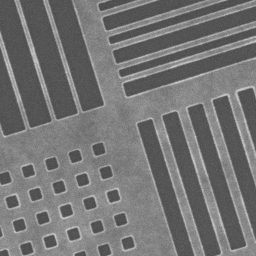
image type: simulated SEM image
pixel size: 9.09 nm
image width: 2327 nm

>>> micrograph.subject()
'groups of lines, slits or small figures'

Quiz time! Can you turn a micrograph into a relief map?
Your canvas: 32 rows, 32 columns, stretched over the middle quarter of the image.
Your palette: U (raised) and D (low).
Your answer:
UDDDDDDUUUUUUUUUDDDDDDDDUUUUDDDD
UDDDDDDUUUUUUUDDDDDDDUUUUDDDDDDD
DDDDDDDDUUUUUUDDDDUUUUDDDDDDDDDD
DUDDDDDDUUUUUUUUUUDDDDDDDDDDDDDD
DUDDDDDDUUUUUUUUDDDDDDDDDDDDDUUU
DUDDDDDDDUUUUUUDDDDDDDDDDUUUUUUU
DDUDDDDDDUUUUUUDDDDDDDUUUUUUUUUU
DDUDDDDDDUUUUUUDDDDUUUUUUUUUUUUU
DDUUDDDDDDUUUUUUUUUUUUUUUUUUUUUU
DDDUDDDDDDUUUUUUUUUUUUUUUUUUUUUU
DDDUDDDDDDUUUUUUUUUUUUUUUUUUUUUU
DDDUDDUUUUUUUUUUUUUUUUUUUUUUUUUD
DDDUUUUUUUUUUUUUUUUUUUUUUDDDDUUD
UUUUUUUUUUUUUUUUUUUUUUUUDDDDDUUD
UUUUUUUUUUUUUUUUUUUDDDUUUDDDDUUU
UUUUUUUUUUUUUUUUUUDDDDDUUDDDDDUU
UUUUUUUUUUUUUUUUUUUDDDDUUDDDDDUU
UUUUUUUUUUUUUUUUUUUDDDDUUUDDDDUU
UUUUUUUUUUUUUUUUUUUDDDDDUUDDDDUU
UUUUUUUUUUUUUUUUUUUDDDDDUUDDDDDU
UUUUUUUDDDUUUUUUUUUUDDDDUUUDDDDU
UUUDUUUDDDUUUUUUUUUUDDDDDUUDDDDU
UDDDUUUDDDUUUUUUUUUUDDDDDUUDDDDD
UDDDUUUUUUUUUUUUUUUUUDDDDUUUDDDD
UUDDUUUUUUUUUUUUUUUUUDDDDUUUDDDD
UUUUUUUUUUUUUUUUUUUUUDDDDDUUDDDD
UUUUUUUUUDDDUUUUUUUUUUDDDDUUDDDD
UUUUDDUUUDDDUUUUUUUUUUDDDDUUUDDD
UUUDDDUUUDDDUUUUUUUUUUDDDDDUUDDD
UUUDDDDUUUUUUUUUUUUUUUUDDDDUUDDD
UUUUDUUUUUUUUUUUUUUUUUUDDDDUUUDD
UUUUUUUUUUUUDUUUUUUUUUUDDDDDUUDD